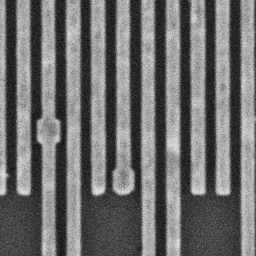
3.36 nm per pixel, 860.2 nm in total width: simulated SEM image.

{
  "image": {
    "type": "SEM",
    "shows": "wiring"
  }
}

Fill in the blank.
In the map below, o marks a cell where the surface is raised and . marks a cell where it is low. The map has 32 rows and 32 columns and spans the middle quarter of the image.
.ooo...ooo...ooo....oo....ooo...
.ooo...ooo...ooo....oo....ooo...
.ooo...ooo...ooo....oo....ooo...
.ooo...ooo...ooo....oo....ooo...
.ooo...ooo...ooo....oo....ooo...
.ooo...ooo...ooo....oo....ooo...
.ooo...ooo...ooo....oo....ooo...
.ooo...ooo...ooo....oo....ooo...
.ooo...ooo...ooo....oo....ooo...
.ooo...ooo...ooo....oo....ooo...
.ooo...ooo...ooo....oo....ooo...
.ooo...ooo...ooo....oo....ooo...
.ooo...ooo...ooo....oo....ooo...
.ooo...ooo...ooo....oo....ooo...
.ooo...ooo...ooo....oo....ooo...
.ooo...ooo...ooo....oo....ooo...
.ooo...ooo...ooo....oo....ooo...
.ooo...ooo...ooo....oo....ooo...
.ooo...ooo...ooo....oo....ooo...
.ooo...ooo...ooo....oo....ooo...
.ooo...ooo...ooo....ooo...ooo...
.ooo...ooo...ooo....ooo...ooo...
.ooo...ooo...oooo...ooo...ooo...
.ooo...ooo...oooo...ooo...ooo...
.ooo...ooo...oooo...ooo...ooo...
.ooo...ooo...oooo...ooo...ooo...
.ooo...ooo...oooo...ooo...ooo...
.ooo...ooo..ooooo...ooo...ooo...
.ooo...ooo..ooooo...ooo...ooo...
.ooo...ooo..ooooo...ooo...ooo...
.ooo...ooo..ooooo...ooo...ooo...
.ooo...ooo...oooo...ooo...ooo...